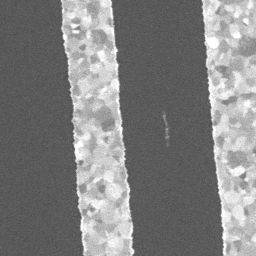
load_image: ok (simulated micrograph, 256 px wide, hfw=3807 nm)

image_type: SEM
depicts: one or a few lines or trenches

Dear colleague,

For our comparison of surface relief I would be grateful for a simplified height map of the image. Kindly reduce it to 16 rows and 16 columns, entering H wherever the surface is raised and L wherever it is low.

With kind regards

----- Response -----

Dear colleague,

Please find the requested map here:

LLLLHHHLLLLLLHHH
LLLLHHHLLLLLLHHH
LLLLHHHLLLLLLHHH
LLLLHHHLLLLLLHHH
LLLLHHHLLLLLLHHH
LLLLHHHLLLLLLHHH
LLLLLHHLLLLLLHHH
LLLLLHHHLLLLLHHH
LLLLLHHHLLLLLHHH
LLLLLHHHLLLLLHHH
LLLLLHHHLLLLLLHH
LLLLLHHHLLLLLLHH
LLLLLHHHLLLLLLHH
LLLLLHHHLLLLLLHH
LLLLLHHHLLLLLLHH
LLLLLHHHLLLLLLHH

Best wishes